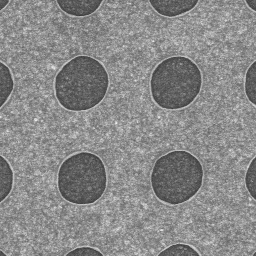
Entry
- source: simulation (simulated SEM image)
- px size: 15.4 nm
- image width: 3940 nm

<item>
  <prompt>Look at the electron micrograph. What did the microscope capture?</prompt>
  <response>holes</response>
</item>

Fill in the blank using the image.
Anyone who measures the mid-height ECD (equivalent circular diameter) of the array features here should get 808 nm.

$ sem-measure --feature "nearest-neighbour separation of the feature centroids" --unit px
94.4